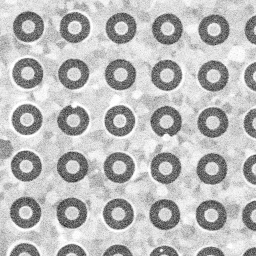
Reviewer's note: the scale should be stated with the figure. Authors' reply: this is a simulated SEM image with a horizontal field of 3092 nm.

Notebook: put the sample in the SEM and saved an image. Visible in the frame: an array of small figures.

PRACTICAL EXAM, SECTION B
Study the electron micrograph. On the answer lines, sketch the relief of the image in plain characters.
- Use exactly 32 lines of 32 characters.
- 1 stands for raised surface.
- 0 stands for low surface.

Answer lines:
11111111111111111111111111111111
11101111101111111111111111111111
11000111000110000110000110001110
11000010000110000110000110000110
11000111000110000110000110000110
11111111111111111111001111001111
11111111111111111111111111111111
11000111001111001111011111111111
10000110000110000110000110001110
10000110000110000110000110000100
11000111000110000110000110001110
11111111111111111111111111111111
11111111111111111111111111111111
11000111000111001111001111011111
10000110000110000110000110001110
10000110000110000110000110000100
11000111000110001110001110001110
11111111111111111111111111111111
11111111111111111111111111111111
11000111000111001110001110001110
10000110000110000110000110001100
10000110000110000110000110001100
11001111001111001110001110001110
11111111111111111111111111111111
11111111111111111111111111111111
10000110000110001110001110001110
10000110000110000110000100001100
10000110000110000110001100001100
11001111001111001111001110001110
11111111111111111111111111111111
11001111001111111111111111111111
10000110000110001110001110001110